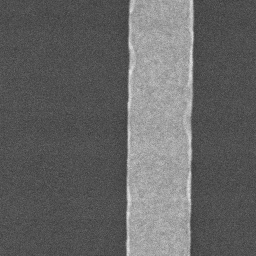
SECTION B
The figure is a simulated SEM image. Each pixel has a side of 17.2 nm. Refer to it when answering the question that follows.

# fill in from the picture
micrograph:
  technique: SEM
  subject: wiring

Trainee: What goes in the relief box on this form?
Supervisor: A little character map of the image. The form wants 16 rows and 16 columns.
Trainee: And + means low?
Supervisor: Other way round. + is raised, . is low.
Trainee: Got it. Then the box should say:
........++++....
........++++....
........++++....
........++++....
........++++....
........++++....
........++++....
........++++....
........++++....
........++++....
........++++....
........++++....
........++++....
........++++....
........++++....
........++++....